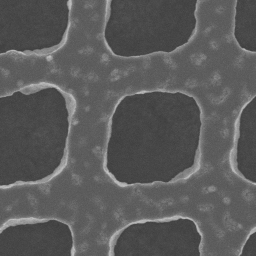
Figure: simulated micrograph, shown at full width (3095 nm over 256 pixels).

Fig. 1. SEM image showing holes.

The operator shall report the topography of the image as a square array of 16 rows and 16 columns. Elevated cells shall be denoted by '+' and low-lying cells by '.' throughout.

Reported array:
....+++.....+++.
....+++.....+++.
....+++.....+++.
++++++++++++++++
++++++++++++++++
++.+++++++++++++
....+++.....++++
....+++......++.
....+++.....+++.
....+++.....+++.
....+++.....+++.
.+++++++++++++++
++++++++++++++++
++++++++++++++++
....++++....++++
....+++.....+++.